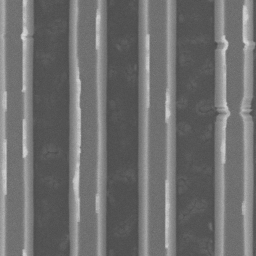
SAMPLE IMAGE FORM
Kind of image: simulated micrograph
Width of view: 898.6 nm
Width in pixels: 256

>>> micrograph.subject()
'one or a few lines or trenches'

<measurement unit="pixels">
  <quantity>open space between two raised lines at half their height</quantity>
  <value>42.8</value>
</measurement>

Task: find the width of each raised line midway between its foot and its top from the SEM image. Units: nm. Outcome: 106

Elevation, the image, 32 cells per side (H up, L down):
HHHHLLLLLHHHHLLLLLHHHHLLLLLHHHHL
HHHHLLLLLHHHHLLLLLHHHHLLLLLHHHHL
HHHHLLLLLHHHHLLLLLHHHHLLLLLHHHHL
HHHHLLLLLHHHHLLLLLHHHHLLLLLHHHHL
HHHHLLLLLHHHHLLLLLHHHHLLLLLHHHHL
HHHHLLLLLHHHHLLLLLHHHHLLLLLHHHHH
HHHHLLLLLHHHHLLLLLHHHHLLLLLHHHHL
HHHHLLLLLHHHHLLLLLHHHHLLLLLHHHHL
HHHHLLLLLHHHHLLLLLHHHHLLLLLHHHHL
HHHHLLLLLHHHHLLLLLHHHHLLLLLHHHHL
HHHHLLLLLHHHHLLLLLHHHHLLLLLHHHHL
HHHHLLLLLHHHHLLLLLHHHHLLLLLHHHHL
HHHHLLLLLHHHHLLLLLHHHHLLLLLHHHHL
HHHHLLLLLHHHHLLLLLHHHHLLLLLHHHHL
HHHHLLLLLHHHHLLLLLHHHHLLLLLLHHHL
HHHHLLLLLHHHHLLLLLHHHHLLLLLHHHHL
HHHHLLLLLHHHHLLLLLHHHHLLLLLHHHHL
HHHHLLLLLHHHHLLLLLHHHHLLLLLHHHHL
HHHHLLLLLHHHHLLLLLHHHHLLLLLHHHHL
HHHHLLLLLHHHHLLLLLHHHHLLLLLHHHHL
HHHHLLLLLHHHHLLLLLHHHHLLLLLHHHHL
HHHHLLLLLHHHHLLLLLHHHHLLLLLHHHHL
HHHHLLLLLHHHHLLLLLHHHHLLLLLHHHHL
HHHHLLLLLHHHHLLLLLHHHHLLLLLHHHHL
HHHHLLLLLHHHHLLLLLHHHLLLLLLHHHHL
HHHHLLLLLHHHHLLLLLHHHLLLLLLHHHHL
HHHHLLLLLHHHHLLLLLHHHLLLLLLHHHHL
HHHHLLLLLHHHHLLLLLHHHLLLLLLHHHHL
HHHHLLLLLHHHHLLLLLHHHLLLLLLHHHHL
HHHHLLLLLHHHHLLLLLHHHLLLLLLHHHHL
HHHHLLLLLHHHHLLLLLHHHLLLLLLHHHHL
HHHHLLLLLHHHHLLLLLHHHLLLLLLHHHHL